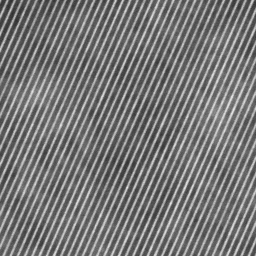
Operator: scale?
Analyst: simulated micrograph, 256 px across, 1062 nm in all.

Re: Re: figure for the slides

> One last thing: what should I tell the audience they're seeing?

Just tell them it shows parallel lines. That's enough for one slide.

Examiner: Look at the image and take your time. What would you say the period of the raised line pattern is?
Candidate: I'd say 27.4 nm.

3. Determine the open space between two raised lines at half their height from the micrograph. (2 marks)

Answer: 22.3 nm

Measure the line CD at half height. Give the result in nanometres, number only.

6.1